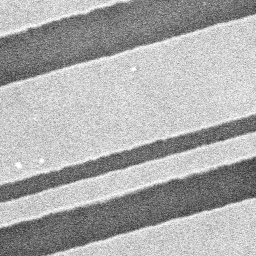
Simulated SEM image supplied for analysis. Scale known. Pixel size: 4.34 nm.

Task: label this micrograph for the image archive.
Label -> lines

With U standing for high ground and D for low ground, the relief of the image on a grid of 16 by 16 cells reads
UUUUUUDDDDDDDDDD
UUUDDDDDDDDDDDUU
DDDDDDDDDDUUUUUU
DDDDDDDUUUUUUUUU
DDDUUUUUUUUUUUUU
UUUUUUUUUUUUUUUU
UUUUUUUUUUUUUUUU
UUUUUUUUUUUUUUUU
UUUUUUUUUUUUUUUU
UUUUUUUUUUUUUUUU
UUUUUUUUUUUUUDDD
UUUUUUUUUUDDDDDD
UUUUUUDDDDDDDDDU
UUUDDDDDDDDDUUUU
DDDDDDDDUUUUUUUU
DDDDDUUUUUUUUUUU